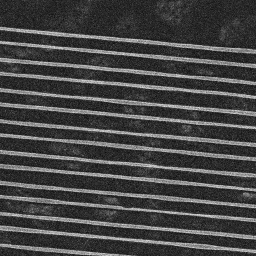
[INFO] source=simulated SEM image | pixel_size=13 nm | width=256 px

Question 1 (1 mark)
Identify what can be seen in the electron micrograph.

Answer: parallel lines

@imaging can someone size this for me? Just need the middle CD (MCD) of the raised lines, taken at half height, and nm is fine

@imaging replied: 35.6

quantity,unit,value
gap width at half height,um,0.151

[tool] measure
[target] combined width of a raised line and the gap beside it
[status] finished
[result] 199 nanometers